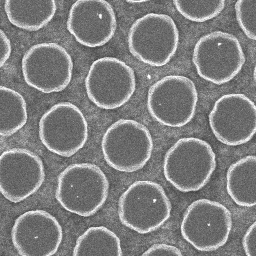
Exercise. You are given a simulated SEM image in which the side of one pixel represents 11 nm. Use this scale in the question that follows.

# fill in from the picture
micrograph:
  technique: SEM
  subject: a regular array of raised bodies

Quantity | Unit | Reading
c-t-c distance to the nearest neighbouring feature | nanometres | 686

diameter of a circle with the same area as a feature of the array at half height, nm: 528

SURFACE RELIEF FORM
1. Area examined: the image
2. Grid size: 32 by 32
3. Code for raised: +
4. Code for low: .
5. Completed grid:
.++++++..++++.........++++++..++
.++++++..+++++.........++++...++
.+++++...+++++...++++.........++
.........+++++...+++++........++
+........+++++..++++++....++...+
+..........++...++++++...+++++..
+...++++.........+++++..++++++..
+..++++++...++....+++...++++++..
...++++++..+++++.........+++++..
...++++++..++++++........++++...
....++++...++++++...++++........
++.........++++++..+++++........
+++.........++++...+++++...++++.
+++....++..........+++++...+++++
+++...++++.........+++++..++++++
+++..++++++...+++....++...++++++
+....++++++..+++++.........+++++
.....++++++..++++++....++...+++.
......++++...++++++...++++......
++++.........++++++..++++++.....
+++++.........++++...++++++...++
+++++...+++++........+++++...+++
+++++...+++++........+++++..++++
+++++..++++++...++++..+++....+++
.++....++++++..++++++........+++
........+++++..++++++...+++...++
....+....+++...++++++..+++++....
..+++++........++++++..++++++...
..+++++.....+....++....++++++..+
..++++++..++++.........+++++...+
..+++++...+++++.........++++...+
...++++..++++++...++++.........+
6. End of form